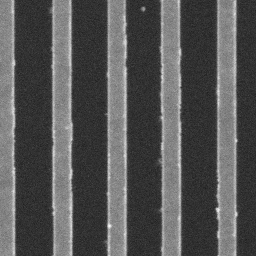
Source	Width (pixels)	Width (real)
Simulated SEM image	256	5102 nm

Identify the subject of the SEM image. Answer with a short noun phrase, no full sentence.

lines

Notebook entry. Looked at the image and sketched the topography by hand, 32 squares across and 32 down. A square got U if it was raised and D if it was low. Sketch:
UUDDDDDUUDDDDDUUDDDDUUDDDDDUUDDD
UUDDDDDUUDDDDDUUDDDDUUDDDDDUUDDD
UUDDDDDUUDDDDDUUDDDDUUDDDDDUUDDD
UUDDDDDUUDDDDDUUDDDDUUDDDDDUUDDD
UUDDDDDUUDDDDDUUDDDDUUDDDDDUUDDD
UUDDDDDUUDDDDDUUDDDDUUDDDDDUUDDD
UUDDDDDUUDDDDDUUDDDDUUUDDDDUUDDD
UUDDDDDUUDDDDDUUDDDDUUDDDDDUUDDD
UUDDDDDUUDDDDDUUDDDDUUDDDDDUUDDD
UUDDDDDUUDDDDDUUDDDDUUDDDDDUUDDD
UUDDDDDUUDDDDDUUDDDDUUDDDDDUUDDD
UUDDDDDUUDDDDDUUDDDDUUUDDDDUUDDD
UUDDDDDUUDDDDDUUDDDDUUDDDDDUUDDD
UUDDDDDUUDDDDDUUDDDDUUDDDDDUUDDD
UUDDDDDUUDDDDDUUDDDDUUDDDDDUUDDD
UUDDDDDUUDDDDDUUDDDDUUUDDDDUUDDD
UUDDDDDUUDDDDDUUDDDDUUDDDDDUUDDD
UUDDDDDUUDDDDDUUDDDDUUDDDDDUUDDD
UUDDDDDUUDDDDDUUDDDDUUDDDDDUUDDD
UUDDDDDUUDDDDDUUDDDDUUDDDDDUUDDD
UUDDDDDUUDDDDDUUDDDDUUUDDDDUUDDD
UUDDDDDUUDDDDDUUDDDDUUUDDDDUUDDD
UUDDDDDUUDDDDDUUDDDDUUUDDDDUUDDD
UUDDDDDUUDDDDDUUDDDDUUUDDDDUUDDD
UUDDDDDUUDDDDDUUDDDDUUUDDDDUUDDD
UUDDDDDUUDDDDDUUDDDDUUUDDDDUUDDD
UUDDDDDUUDDDDDUUDDDDUUUDDDDUUDDD
UUDDDDDUUDDDDDUUDDDDUUUDDDDUUDDD
UUDDDDDUUDDDDDUUDDDDUUUDDDDUUDDD
UUDDDDDUUDDDDDUUDDDDUUUDDDDUUDDD
UUDDDDDUUDDDDDUUDDDDUUUDDDDUUDDD
UUDDDDDUUDDDDDUUDDDDUUUDDDDUUDDD